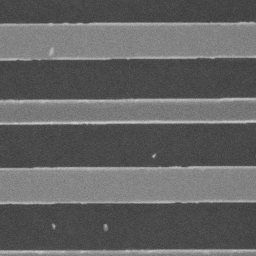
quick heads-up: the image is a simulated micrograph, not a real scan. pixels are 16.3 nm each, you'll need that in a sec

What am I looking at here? lines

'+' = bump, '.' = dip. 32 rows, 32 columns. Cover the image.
................................
................................
................................
++++++++++++++++++++++++++++++++
++++++++++++++++++++++++++++++++
++++++++++++++++++++++++++++++++
++++++++++++++++++++++++++++++++
................................
................................
................................
................................
................................
................................
++++++++++++++++++++++++++++++++
++++++++++++++++++++++++++++++++
................................
................................
................................
................................
................................
................................
++++++++++++++++++++++++++++++++
++++++++++++++++++++++++++++++++
++++++++++++++++++++++++++++++++
++++++++++++++++++++++++++++++++
................................
................................
................................
................................
................................
................................
.............................++.